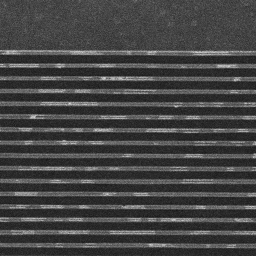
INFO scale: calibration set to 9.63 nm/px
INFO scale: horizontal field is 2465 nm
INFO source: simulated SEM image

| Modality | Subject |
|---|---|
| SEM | parallel lines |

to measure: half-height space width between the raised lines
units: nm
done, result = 84.3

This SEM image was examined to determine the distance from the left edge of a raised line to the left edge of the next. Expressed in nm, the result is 124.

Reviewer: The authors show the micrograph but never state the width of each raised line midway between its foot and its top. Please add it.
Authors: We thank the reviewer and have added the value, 37.3 nanometers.